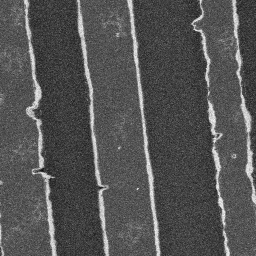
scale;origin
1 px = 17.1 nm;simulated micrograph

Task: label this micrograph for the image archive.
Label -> one or a few lines or trenches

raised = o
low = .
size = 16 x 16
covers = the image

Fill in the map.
oo...ooo.....oo.
oo...ooo....ooo.
oo...ooo.....oo.
oo...ooo.....oo.
oo...oooo....oo.
oo....ooo....oo.
oo....ooo....oo.
oo....ooo....oo.
oo....ooo....ooo
ooo...ooo....ooo
ooo...ooo.....oo
ooo...ooo.....oo
ooo...oooo....oo
ooo...oooo....oo
ooo....ooo....oo
ooo....ooo....oo